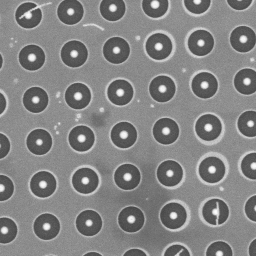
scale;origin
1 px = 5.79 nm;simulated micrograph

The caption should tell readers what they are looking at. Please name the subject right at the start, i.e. an array of small figures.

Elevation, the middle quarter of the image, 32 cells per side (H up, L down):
HLLLHHHHHHHHHHHHHHHHHHHHHHHHHHHH
HHHHHHHHHHHHHHHHHHHHHHHHHHHHHHHH
HHHHHHHHHHHHHHHHHHHHHHHHHHHHHHHH
HHHHHHHHHHHHHHHHHHHHHHLLLLLHHHHH
HHHHHHHHHHHHLLLLHHHHHHLLLLLLHHHH
HLLLLLHHHHHLLLLLLHHHHLLLLLLLHHHH
HLLLLLHHHHHLLLLLLLHHHLLLHLLLHHHH
LLLHLLLHHHHLLLHLLHHHHHLLLLLLHHHH
LLLHLLLHHHHLLLLLLHHHHHLLLLLHHHHH
LLLLLLHHHHHHLLLLLHHHHHHHLHHHHHHH
HLLLLLHHHHHHHLHHHHHHHHHHHHHHHHHH
HHHHHHHHHHHHHHHHHHHHHHHHHHHHHHHH
HHHHHHHHHHHHHHHHHHHHHHHHHHHHHHHH
HHHHHHHHHHHHHHHHHHHHHHHHLLHHHHHH
HHHHHHHHHHHHHHLLHHHHHHHLLLLLHHHH
HHHLLLHHHHHHLLLLLHHHHHLLLLLLLHHH
HHLLLLLHHHHHLLLLLLHHHHLLLHLLLHHH
HLLLLLLLHHHLLLHHLLHHHHLLLLLLLHHH
HLLLHLLLHHHHLLLLLLHHHHHLLLLLHHHH
HLLLLLLLHHHHLLLLLLHHHHHLLLLHHHHH
HHLLLLLHHHHHHLLLLHHHHHHHHHHHHHHH
HHHLLLHHHHHHHHHHHHHHHHHHHHHHHHHH
HHHHHHHHHHHHHHHHHHHHHHHHHHHHHHHH
HHHHHHHHHHHHHHHHHHHHHHHHHHHHHHHH
HHHHHHHHHHHHHHHHHHHHHHHHHLLLHHHH
HHHHHHHHHHHHHHLLLLHHHHHHLLLLLHHH
HHHLLLLLHHHHHLLLLLLHHHHLLLLLLLHH
HHLLLLLLLHHHHLLLLLLHHHHLLLHLLLHH
HHLLLLLLLHHHLLLHHLLHHHHLLLLLLLHH
HHLLLHLLLHHHHLLLLLLHHHHHLLLLLHHH
HHLLLLLLLHHHHLLLLLHHHHHHHLLLHHHH
HHHLLLLLHHHHHHHLLHHHHHHHHHHHHHHH